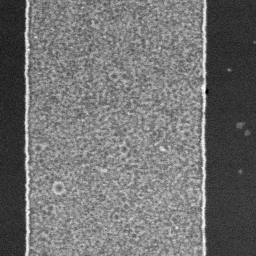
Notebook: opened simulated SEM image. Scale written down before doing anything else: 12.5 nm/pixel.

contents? one or a few lines or trenches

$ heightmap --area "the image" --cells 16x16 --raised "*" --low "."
..***********...
..***********...
..***********...
..***********...
..***********...
..***********...
..***********...
..***********...
..***********...
..***********...
..***********...
..***********...
..***********...
..***********...
..***********...
..***********...